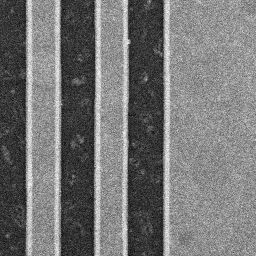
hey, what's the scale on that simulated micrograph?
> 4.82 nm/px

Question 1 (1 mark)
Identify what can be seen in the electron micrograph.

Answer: one or a few lines or trenches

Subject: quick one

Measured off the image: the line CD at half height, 130 nanometers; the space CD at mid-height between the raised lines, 200 nm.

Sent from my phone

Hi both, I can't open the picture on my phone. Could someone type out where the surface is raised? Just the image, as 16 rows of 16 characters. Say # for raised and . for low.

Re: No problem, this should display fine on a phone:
..##..##..######
..##..##..######
..##..##..######
..##..##..######
..##..##..######
..##..##...#####
..##..##...#####
..##..##...#####
..##..##...#####
..##..##..######
..##..##..######
..##..##..######
..##..##..######
..##..##...#####
..##..##..######
..##..##..######